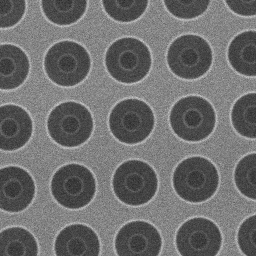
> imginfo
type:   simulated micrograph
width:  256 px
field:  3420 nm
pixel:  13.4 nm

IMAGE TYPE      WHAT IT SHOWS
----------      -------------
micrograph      an array of small figures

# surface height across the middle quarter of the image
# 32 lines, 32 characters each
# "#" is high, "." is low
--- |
###....###....####....####.....#
###...#####..........######.....
......#####..........#######....
.....#######........#########...
....##########.....#############
..##############################
################################
################################
################..###########...
...###########......########....
.....########........######.....
......######..........#####....#
.......####....###.....###....##
###....####....####....###....##
####...####....####....###....##
####...####....####....####....#
###....#####....##....#####.....
.......#####..........######....
......#######........########...
.....#########.....############.
....############################
################################
################################
###############################.
###############.....#########...
.....#########........######....
......#######..........#####....
.......#####.....##....####....#
.###....####....####...####....#
#####...####...#####....###....#
#####...####....####....###....#
####....####....###....#####....